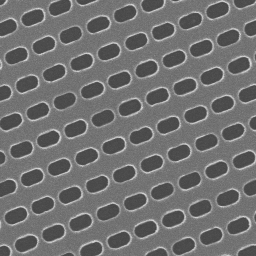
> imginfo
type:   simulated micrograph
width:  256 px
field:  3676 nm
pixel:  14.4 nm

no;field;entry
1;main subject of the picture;a regular array of holes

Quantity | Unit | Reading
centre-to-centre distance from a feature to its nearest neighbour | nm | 416